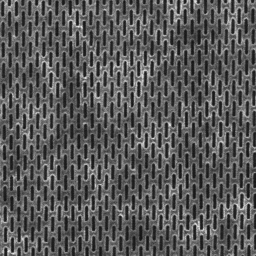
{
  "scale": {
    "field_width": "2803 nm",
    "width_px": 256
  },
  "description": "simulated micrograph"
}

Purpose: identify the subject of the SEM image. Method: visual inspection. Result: a regular array of holes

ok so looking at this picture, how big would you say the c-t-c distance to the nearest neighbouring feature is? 131 nm